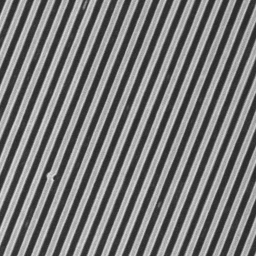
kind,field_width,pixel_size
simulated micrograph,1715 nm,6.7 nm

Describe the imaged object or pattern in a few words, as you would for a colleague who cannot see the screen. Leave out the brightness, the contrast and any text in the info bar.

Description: parallel lines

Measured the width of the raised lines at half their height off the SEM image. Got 40.5 nanometers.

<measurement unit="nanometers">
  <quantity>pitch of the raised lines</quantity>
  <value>87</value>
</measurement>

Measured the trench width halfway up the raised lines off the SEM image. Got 0.0468 microns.